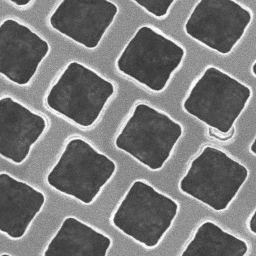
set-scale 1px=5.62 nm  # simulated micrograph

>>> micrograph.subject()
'holes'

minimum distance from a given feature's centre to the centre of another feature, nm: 434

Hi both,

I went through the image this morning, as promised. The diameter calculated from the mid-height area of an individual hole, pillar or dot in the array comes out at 328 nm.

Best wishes